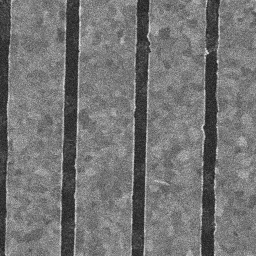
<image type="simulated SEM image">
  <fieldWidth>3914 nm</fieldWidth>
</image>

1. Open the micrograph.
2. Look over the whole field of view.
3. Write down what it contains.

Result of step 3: one or a few lines or trenches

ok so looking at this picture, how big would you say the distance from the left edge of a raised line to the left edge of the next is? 69.8 pixels